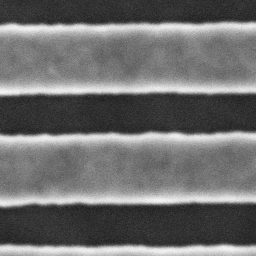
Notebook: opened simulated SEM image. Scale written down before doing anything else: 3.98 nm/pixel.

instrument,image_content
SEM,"lines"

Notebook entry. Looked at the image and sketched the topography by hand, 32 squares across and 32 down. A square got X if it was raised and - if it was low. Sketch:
--------------------------------
--------------------------------
--------------------------------
XXXXXXXXXXXXXXXXXXXXXXXXXXXXXXXX
XXXXXXXXXXXXXXXXXXXXXXXXXXXXXXXX
XXXXXXXXXXXXXXXXXXXXXXXXXXXXXXXX
XXXXXXXXXXXXXXXXXXXXXXXXXXXXXXXX
XXXXXXXXXXXXXXXXXXXXXXXXXXXXXXXX
XXXXXXXXXXXXXXXXXXXXXXXXXXXXXXXX
XXXXXXXXXXXXXXXXXXXXXXXXXXXXXXXX
XXXXXXXXXXXXXXXXXXXXXXXXXXXXXXXX
XXXXXXXXXXXXXXXXXXX---XXXXXXXXXX
--------------------------------
--------------------------------
--------------------------------
--------------------------------
--------------------------------
XXXXXXXXXXXXXXXXXXXXXXXXXXXXXXXX
XXXXXXXXXXXXXXXXXXXXXXXXXXXXXXXX
XXXXXXXXXXXXXXXXXXXXXXXXXXXXXXXX
XXXXXXXXXXXXXXXXXXXXXXXXXXXXXXXX
XXXXXXXXXXXXXXXXXXXXXXXXXXXXXXXX
XXXXXXXXXXXXXXXXXXXXXXXXXXXXXXXX
XXXXXXXXXXXXXXXXXXXXXXXXXXXXXXXX
XXXXXXXXXXXXXXXXXXXXXXXXXXXXXXXX
XXX-----------------------------
--------------------------------
--------------------------------
--------------------------------
--------------------------------
--------------------------------
XXXXXXXXXXXXXXXXXXXXXXXXXXXXXXXX